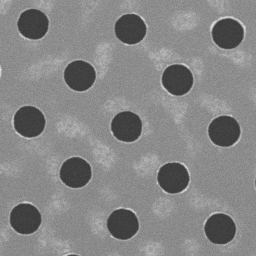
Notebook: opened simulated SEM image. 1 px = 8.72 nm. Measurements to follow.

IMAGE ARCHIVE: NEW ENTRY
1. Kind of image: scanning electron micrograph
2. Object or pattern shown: a regular array of holes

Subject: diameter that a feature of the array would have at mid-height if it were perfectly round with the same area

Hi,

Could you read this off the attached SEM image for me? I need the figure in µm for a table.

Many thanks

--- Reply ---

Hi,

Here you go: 0.274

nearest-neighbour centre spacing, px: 68.3